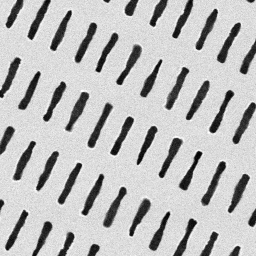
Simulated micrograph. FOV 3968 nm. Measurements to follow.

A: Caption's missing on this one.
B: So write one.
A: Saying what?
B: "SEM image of a regular array of holes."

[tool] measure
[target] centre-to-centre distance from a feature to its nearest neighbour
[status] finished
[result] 0.399 microns